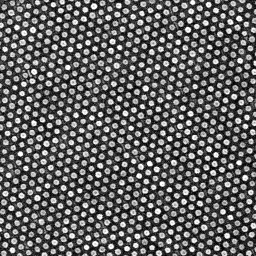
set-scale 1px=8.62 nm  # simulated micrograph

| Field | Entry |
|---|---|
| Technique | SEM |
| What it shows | a regular array of raised bodies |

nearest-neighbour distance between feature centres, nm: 77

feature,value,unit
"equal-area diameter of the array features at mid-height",42.4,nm